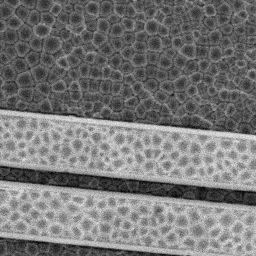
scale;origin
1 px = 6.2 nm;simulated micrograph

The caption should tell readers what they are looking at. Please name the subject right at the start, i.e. one or a few lines or trenches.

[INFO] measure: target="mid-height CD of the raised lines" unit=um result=0.316